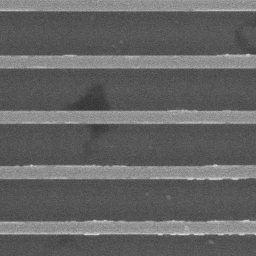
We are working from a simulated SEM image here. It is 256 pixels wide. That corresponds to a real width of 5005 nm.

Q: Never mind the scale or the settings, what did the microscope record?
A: lines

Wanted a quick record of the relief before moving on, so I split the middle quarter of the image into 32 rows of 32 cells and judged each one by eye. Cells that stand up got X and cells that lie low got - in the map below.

XXXXXXXXXXXXXXXXXXXXXXXXXXXXXXXX
--------------------------------
--------------------------------
--------------------------------
--------------------------------
--------------------------------
--------------------------------
--------------------------------
--------------------------------
--------------------------------
--------------------------------
--------------------------------
XXXXXXXXXXXXXXXXXXXXXXXXXXXXXXXX
XXXXXXXXXXXXXXXXXXXXXXXXXXXXXXXX
XXXXXXXXXXXXXXXXXXXXXXXXXXXXXXXX
--------------------------------
--------------------------------
--------------------------------
--------------------------------
--------------------------------
--------------------------------
--------------------------------
--------------------------------
--------------------------------
--------------------------------
--------------------------------
XXXXXXXXXXXXXXXXXXXXXXXXXXXXXXXX
XXXXXXXXXXXXXXXXXXXXXXXXXXXXXXXX
XXXXXXXXXXXXXXXXXXXXXXXXXXXXXXXX
--------------------------------
--------------------------------
--------------------------------